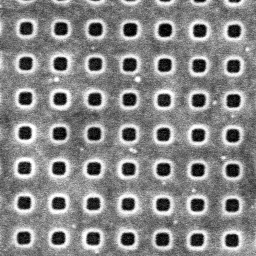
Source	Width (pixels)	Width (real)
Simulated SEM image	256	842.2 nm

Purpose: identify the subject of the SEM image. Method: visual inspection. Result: a regular array of holes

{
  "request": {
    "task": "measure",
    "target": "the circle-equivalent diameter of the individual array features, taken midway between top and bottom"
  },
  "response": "52.2 nanometers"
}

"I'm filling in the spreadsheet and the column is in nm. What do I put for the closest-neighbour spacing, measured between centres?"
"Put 114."